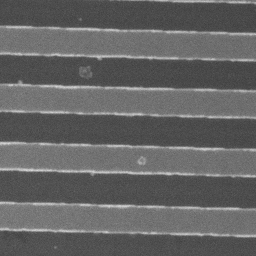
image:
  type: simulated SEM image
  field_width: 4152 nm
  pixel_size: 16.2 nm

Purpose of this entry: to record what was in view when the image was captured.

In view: lines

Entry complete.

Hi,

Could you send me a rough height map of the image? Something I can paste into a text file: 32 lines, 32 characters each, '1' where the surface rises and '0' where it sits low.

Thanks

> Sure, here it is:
00000000000000000000000000000000
00000000000000000000000000000000
00000000000000000000000000000000
11111111000000000000000000000000
11111111111111111111111111111111
11111111111111111111111111111111
11111111111111111111111111111111
00000000000000000000000000001111
00000000000000000000000000000000
00000000000000000000000000000000
00000000000000000000000000000000
11111111111111111111111111111111
11111111111111111111111111111111
11111111111111111111111111111111
00000000000000000000001111111111
00000000000000000000000000000000
00000000000000000000000000000000
00000000000000000000000000000000
11111111111111111111111110000000
11111111111111111111111111111111
11111111111111111111111111111111
00000000000111111111111111111111
00000000000000000000000000000000
00000000000000000000000000000000
00000000000000000000000000000000
11111111100000000000000000000000
11111111111111111111111111111111
11111111111111111111111111111111
11111111111111111111111111111111
00000000000000000000000000000111
00000000000000000000000000000000
00000000000000000000000000000000